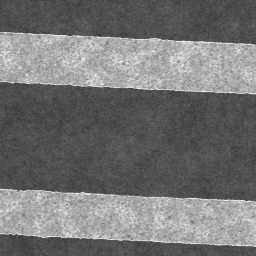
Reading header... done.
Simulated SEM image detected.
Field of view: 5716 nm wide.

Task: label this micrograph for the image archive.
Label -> one or a few lines or trenches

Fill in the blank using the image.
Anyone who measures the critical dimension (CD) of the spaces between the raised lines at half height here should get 2400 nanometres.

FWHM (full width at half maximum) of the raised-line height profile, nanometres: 1010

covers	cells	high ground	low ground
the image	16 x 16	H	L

LLLLLLLLLLLLLLLL
LLLLLLLLLLLLLLLL
HHHHHHHHHHLLLLLL
HHHHHHHHHHHHHHHH
HHHHHHHHHHHHHHHH
LLLLLLLLLHHHHHHH
LLLLLLLLLLLLLLLL
LLLLLLLLLLLLLLLL
LLLLLLLLLLLLLLLL
LLLLLLLLLLLLLLLL
LLLLLLLLLLLLLLLL
LLLLLLLLLLLLLLLL
HHHHHHHHHHHHHHLL
HHHHHHHHHHHHHHHH
HHHHHHHHHHHHHHHH
LLLLLLLLLLLLLLLL